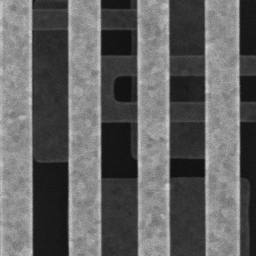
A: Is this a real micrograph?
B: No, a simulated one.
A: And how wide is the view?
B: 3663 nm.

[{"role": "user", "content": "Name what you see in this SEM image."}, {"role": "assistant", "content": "wiring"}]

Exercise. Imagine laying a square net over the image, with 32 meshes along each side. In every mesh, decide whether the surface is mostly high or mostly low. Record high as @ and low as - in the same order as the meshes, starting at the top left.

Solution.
@@@@-----@@@@----@@@@-----@@@@--
@@@@-----@@@@----@@@@-----@@@@--
@@@@-----@@@@----@@@@-----@@@@--
@@@@-----@@@@----@@@@-----@@@@--
@@@@-----@@@@----@@@@-----@@@@--
@@@@-----@@@@----@@@@-----@@@@--
@@@@-----@@@@----@@@@-----@@@@--
@@@@-----@@@@----@@@@-----@@@@--
@@@@-----@@@@----@@@@-----@@@@--
@@@@-----@@@@----@@@@-----@@@@--
@@@@-----@@@@----@@@@-----@@@@--
@@@@-----@@@@----@@@@-----@@@@--
@@@@-----@@@@----@@@@-----@@@@--
@@@@-----@@@@----@@@@-----@@@@--
@@@@-----@@@@----@@@@-----@@@@--
@@@@-----@@@@----@@@@-----@@@@--
@@@@-----@@@@----@@@@-----@@@@--
@@@@-----@@@@----@@@@-----@@@@--
@@@@-----@@@@----@@@@-----@@@@--
@@@@-----@@@@----@@@@-----@@@@--
@@@@-----@@@@----@@@@-----@@@@--
@@@@-----@@@@----@@@@-----@@@@--
@@@@-----@@@@----@@@@-----@@@@--
@@@@-----@@@@----@@@@-----@@@@--
@@@@-----@@@@----@@@@-----@@@@--
@@@@-----@@@@----@@@@-----@@@@--
@@@@-----@@@@----@@@@-----@@@@--
@@@@-----@@@@----@@@@-----@@@@--
@@@@-----@@@@----@@@@-----@@@@--
@@@@-----@@@@----@@@@-----@@@@--
@@@@-----@@@@----@@@@-----@@@@--
@@@@-----@@@@----@@@@-----@@@@--